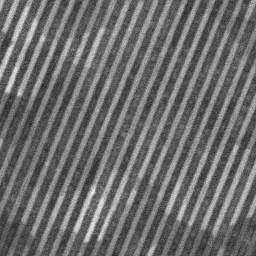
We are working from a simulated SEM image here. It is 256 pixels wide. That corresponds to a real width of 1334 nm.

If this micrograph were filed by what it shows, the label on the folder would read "parallel lines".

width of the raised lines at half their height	19.9	nm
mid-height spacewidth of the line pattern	45.8	nm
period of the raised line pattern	12.9	pixels